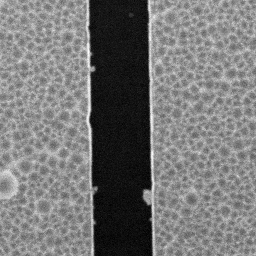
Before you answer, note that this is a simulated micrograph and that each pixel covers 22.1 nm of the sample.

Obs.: one or a few lines or trenches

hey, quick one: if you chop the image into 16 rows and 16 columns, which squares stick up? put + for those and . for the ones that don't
+++++....+++++++
+++++....+++++++
+++++....+++++++
++++++...+++++++
++++++...+++++++
++++++...+++++++
++++++...+++++++
++++++...+++++++
++++++...+++++++
++++++....++++++
++++++....++++++
++++++....++++++
++++++....++++++
++++++....++++++
++++++....++++++
++++++....++++++